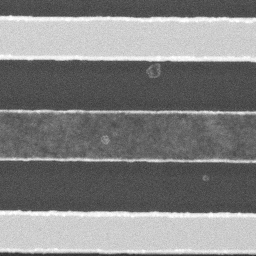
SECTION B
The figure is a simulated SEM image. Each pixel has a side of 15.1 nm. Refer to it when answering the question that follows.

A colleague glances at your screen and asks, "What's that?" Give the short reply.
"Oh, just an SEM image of lines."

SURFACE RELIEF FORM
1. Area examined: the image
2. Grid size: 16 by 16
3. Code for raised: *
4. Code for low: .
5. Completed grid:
................
****************
****************
****************
................
................
................
****************
****************
****************
................
................
................
****************
****************
****************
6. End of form